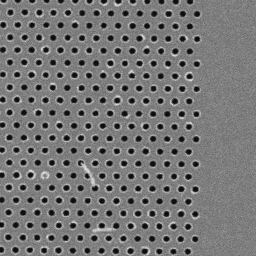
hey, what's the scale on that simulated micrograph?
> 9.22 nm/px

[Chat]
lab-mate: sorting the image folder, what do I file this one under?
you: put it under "a regular array of holes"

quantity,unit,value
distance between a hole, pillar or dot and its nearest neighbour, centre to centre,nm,130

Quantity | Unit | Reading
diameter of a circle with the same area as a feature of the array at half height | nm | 53.1